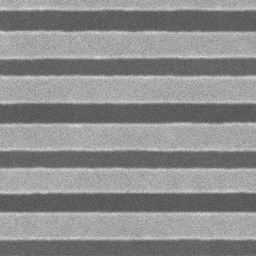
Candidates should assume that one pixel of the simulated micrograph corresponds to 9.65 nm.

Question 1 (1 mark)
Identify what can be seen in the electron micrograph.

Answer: lines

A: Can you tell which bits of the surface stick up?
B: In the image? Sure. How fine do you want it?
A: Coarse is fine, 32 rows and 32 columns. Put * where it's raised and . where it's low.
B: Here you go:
********************************
................................
................................
................................
********************************
********************************
********************************
................................
................................
................................
********************************
********************************
********************************
................................
................................
.....................***....****
********************************
********************************
********************************
................................
................................
********************************
********************************
********************************
................................
................................
................................
********************************
********************************
********************************
................................
................................